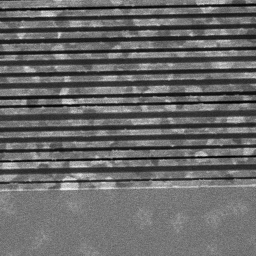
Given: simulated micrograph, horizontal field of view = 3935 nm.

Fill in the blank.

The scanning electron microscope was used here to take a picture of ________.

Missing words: parallel lines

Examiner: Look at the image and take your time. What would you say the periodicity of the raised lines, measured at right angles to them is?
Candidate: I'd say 0.166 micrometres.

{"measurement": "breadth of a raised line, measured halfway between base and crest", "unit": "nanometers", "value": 98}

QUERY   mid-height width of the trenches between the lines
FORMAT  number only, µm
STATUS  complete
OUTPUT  0.0692